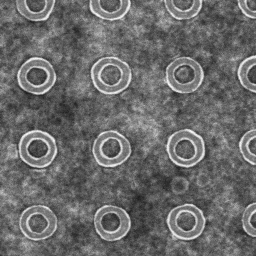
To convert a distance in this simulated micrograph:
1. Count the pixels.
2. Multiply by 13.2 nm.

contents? a regular array of ring-shaped raised bodies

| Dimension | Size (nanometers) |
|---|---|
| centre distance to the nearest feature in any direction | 964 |